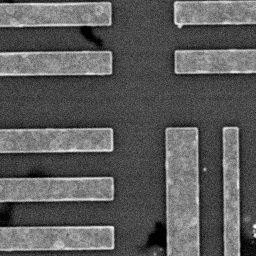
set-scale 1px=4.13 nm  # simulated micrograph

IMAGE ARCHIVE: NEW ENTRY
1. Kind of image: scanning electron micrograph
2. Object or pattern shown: groups of lines, slits or small figures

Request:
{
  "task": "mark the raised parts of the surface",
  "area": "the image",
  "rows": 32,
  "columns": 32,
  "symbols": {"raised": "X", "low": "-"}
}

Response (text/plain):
----------XXX---------XXXXXXXXXX
XXXXXXXXXXXXXX--------XXXXXXXXXX
XXXXXXXXXXXXXX--------XXXXXXXXXX
--------------------------------
--------------------------------
--------------------------------
----------------------X-X-XXXXXX
XXXXXXXXXXXXXX--------XXX-XXXXXX
XXXXXXXXXXXXXX--------XXXXXXXXXX
--------------------------------
--------------------------------
--------------------------------
--------------------------------
--------------------------------
--------------------------------
--------------------------------
XXXXXXXXXXXXXX-------XXXX---XX--
XXXXXXXXXXXXXX-------XXXX---XX--
XXXXXXXXXXXXXX-------XXXX---XX--
---------------------XXXX---XX--
---------------------XXXX---XX--
---------------------XXXX---XX--
XXXXXXXXXXXXXX-------XXXX---XX--
XXXXXXXXXXXXXX-------XXXX---XX--
XXXXXXXXXXXXXX-------XXXX---XX--
---------------------XXXX---XX--
---------------------XXXX---XX--
---------------------XXXX---XX--
-----XXX----XX-------XXXX---XX--
XXXXXXXXXXXXXX-------XXXX---XX--
XXXXXXXXXXXXXX-------XXXX---XX--
---------------------XXXX---XX--